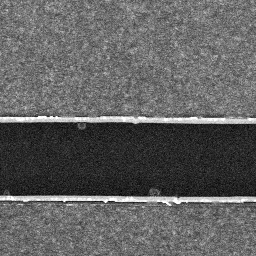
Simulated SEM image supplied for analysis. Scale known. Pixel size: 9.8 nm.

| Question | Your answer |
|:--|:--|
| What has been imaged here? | one or a few lines or trenches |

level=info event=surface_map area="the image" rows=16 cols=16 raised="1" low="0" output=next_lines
1111111111111111
1111111111111111
1111111111111111
1111111111111111
1111111111111111
1111111111111111
1111111111111111
1100000110111111
0000000000000000
0000000000000000
0000000000000000
0000000000000000
1111111111111011
1111111111111111
1111111111111111
1111111111111111